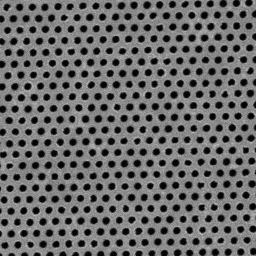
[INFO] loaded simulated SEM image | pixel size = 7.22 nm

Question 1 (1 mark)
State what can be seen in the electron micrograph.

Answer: a regular array of holes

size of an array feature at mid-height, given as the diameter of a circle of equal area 0.0509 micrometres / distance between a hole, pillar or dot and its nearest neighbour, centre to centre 0.0899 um